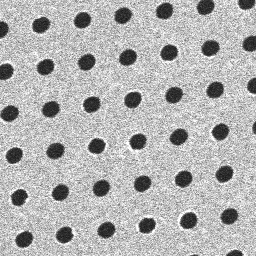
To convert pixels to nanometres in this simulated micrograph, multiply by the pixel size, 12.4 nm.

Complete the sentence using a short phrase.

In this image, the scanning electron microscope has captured a regular array of holes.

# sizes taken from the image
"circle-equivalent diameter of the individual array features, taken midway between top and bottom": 210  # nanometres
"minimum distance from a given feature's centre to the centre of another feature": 41.3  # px